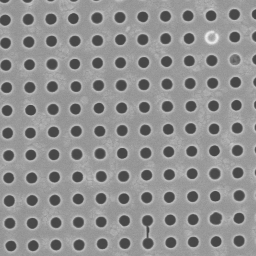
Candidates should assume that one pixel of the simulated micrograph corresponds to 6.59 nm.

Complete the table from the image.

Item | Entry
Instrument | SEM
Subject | a regular array of holes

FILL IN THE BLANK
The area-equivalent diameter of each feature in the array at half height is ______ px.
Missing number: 10.5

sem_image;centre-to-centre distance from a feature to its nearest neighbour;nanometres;146